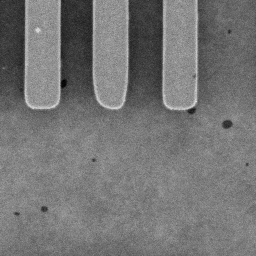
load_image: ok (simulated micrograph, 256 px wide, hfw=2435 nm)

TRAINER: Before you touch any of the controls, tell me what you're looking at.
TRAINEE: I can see wiring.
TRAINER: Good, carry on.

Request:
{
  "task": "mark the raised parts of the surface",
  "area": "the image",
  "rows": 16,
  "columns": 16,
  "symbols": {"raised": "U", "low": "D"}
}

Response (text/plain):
DDUUDDUUDDUUDDDD
DDUUDDUUDDUUDDDD
DDUUDDUUDDUUDDDD
DDUUDDUUDDUUDDDD
DDUUDDUUDDUUDDDD
DDUUDDUUDDUUDDDD
DDUDDDUUDDUUDDDD
DDDDDDDDDDDDDDDD
DDDDDDDDDDDDDDDD
DDDDDDDDDDDDDDDD
DDDDDDDDDDDDDDDD
DDDDDDDDDDDDDDDD
DDDDDDDDDDDDDDDD
DDDDDDDDDDDDDDDD
DDDDDDDDDDDDDDDD
DDDDDDDDDDDDDDDD